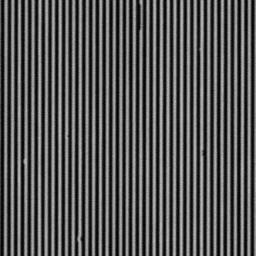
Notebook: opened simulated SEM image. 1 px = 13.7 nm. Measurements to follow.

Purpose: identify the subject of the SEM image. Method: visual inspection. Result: parallel lines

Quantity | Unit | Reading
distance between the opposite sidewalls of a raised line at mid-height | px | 2.75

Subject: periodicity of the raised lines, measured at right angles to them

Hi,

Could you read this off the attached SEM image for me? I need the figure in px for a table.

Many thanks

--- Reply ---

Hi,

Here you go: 6.76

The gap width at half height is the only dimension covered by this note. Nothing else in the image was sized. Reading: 51.3 nm